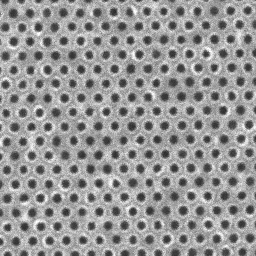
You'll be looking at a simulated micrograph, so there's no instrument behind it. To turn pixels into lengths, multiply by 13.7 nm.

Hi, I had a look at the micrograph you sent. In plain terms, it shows a regular array of holes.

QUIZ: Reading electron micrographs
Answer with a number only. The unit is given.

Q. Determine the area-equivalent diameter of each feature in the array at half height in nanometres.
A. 138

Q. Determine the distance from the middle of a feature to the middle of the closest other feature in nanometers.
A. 222